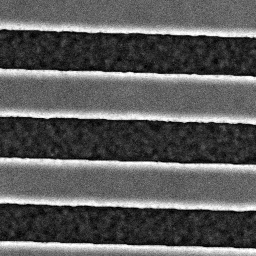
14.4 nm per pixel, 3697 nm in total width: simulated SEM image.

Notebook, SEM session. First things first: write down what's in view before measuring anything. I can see lines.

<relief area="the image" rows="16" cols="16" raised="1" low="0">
1111111111111111
1111111111111111
0000000000000000
0000000000000000
1111110000000000
1111111111111111
1111111111111111
0000000001111111
0000000000000000
0000000000000000
1111111111111111
1111111111111111
1111111111111111
0000000000000000
0000000000000000
1111111111111100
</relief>